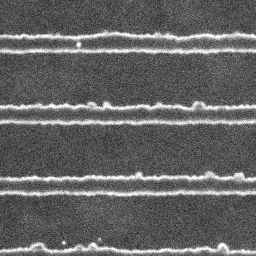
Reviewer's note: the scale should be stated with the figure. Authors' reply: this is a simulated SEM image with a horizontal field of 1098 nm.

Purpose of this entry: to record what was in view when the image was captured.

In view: lines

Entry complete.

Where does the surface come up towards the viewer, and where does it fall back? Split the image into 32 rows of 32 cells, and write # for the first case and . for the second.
................................
................................
................................
................................
#######...############..########
################################
.###.##....##......#.###.##....#
................................
................................
................................
................................
................................
................................
#######################.########
################################
................................
................................
................................
................................
................................
................................
................................
################################
################################
................................
................................
................................
................................
................................
................................
................................
################################